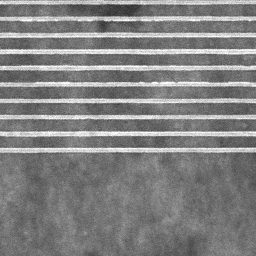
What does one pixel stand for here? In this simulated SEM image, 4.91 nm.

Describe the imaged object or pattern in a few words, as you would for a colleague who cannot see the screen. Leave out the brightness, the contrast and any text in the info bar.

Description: parallel lines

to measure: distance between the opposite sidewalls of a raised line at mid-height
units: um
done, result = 0.0172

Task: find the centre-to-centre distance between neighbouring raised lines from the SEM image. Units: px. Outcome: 16.4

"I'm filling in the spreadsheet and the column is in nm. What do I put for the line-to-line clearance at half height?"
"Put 63.2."